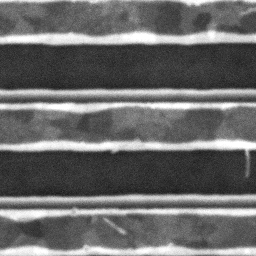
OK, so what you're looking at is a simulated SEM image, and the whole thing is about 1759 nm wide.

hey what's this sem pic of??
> lines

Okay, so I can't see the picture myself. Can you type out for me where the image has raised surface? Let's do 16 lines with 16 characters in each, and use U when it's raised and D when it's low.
UUUUUUUUUUUUUUUU
UUUUUUUUUUUUUUUU
UUUUUUUUUUUUUUUU
DDDDDDDDDDDDDDDD
DDDDDDDDDDDDDDDD
DDDDDDDDDDDDDDDD
DDUDDUUUUUUUUUUU
UUUUUUUUUUUUUUUU
UUUUUUUUUUUUUUUU
DDDDDDDDDDDDDDDD
DDDDDDDDDDDDDDDD
DDDDDDDDDDDDDDDD
DDDDDDDDDDDDDDDD
UUUUUUUUUUUUUUUU
UUUUUUUUUUUUUUUU
UUUUUUUUUUUUUUUU